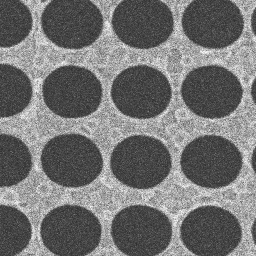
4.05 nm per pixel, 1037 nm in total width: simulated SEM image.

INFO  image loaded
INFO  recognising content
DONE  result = holes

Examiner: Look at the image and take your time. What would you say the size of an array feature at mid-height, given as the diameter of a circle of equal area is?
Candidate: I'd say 234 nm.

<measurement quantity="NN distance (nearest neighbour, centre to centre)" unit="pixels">68.9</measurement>